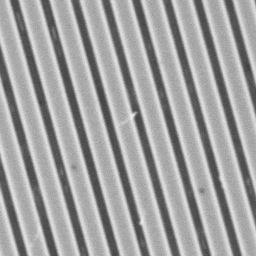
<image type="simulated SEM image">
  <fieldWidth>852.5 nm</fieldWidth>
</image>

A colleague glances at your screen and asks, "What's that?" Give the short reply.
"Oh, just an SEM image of parallel lines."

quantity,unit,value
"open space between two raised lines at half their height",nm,30.9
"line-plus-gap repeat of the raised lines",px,29.5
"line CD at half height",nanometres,67.4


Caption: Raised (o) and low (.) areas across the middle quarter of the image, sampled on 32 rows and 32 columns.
.ooooo..oooooo..ooooo...ooooo..o
.ooooo...ooooo..oooooo..ooooo...
..ooooo..ooooo...ooooo..oooooo..
..ooooo..oooooo..ooooo...ooooo..
..ooooo...ooooo..ooooo...ooooo..
..oooooo..ooooo..oooooo..ooooo..
...ooooo..ooooo...ooooo..oooooo.
...ooooo..oooooo..ooooo...ooooo.
o..ooooo...ooooo..oooooo..ooooo.
o..oooooo..ooooo...ooooo..ooooo.
o...ooooo..oooooo..ooooo..oooooo
oo..ooooo...ooooo..oooooo..ooooo
oo..ooooo...oooooo.oooooo..ooooo
oo...ooooo..ooooo...ooooo..ooooo
oo...ooooo..oooooo..ooooo...oooo
ooo..ooooo...ooooo..oooooo..oooo
ooo..oooooo..ooooo..oooooo..oooo
ooo...ooooo..ooooo...ooooo..oooo
ooo...ooooo..oooooo..ooooo...ooo
oooo..ooooo...ooooo..oooooo..ooo
oooo..oooooo..ooooo...ooooo..ooo
oooo...ooooo..ooooo...ooooo...oo
ooooo..ooooo...ooooo..oooooo..oo
ooooo..oooooo..ooooo..oooooo..oo
ooooo...ooooo..ooooo...ooooo..oo
ooooo...ooooo..oooooo..ooooo...o
oooooo..ooooo...ooooo..ooooo...o
.ooooo..oooooo..ooooo...ooooo..o
.ooooo...ooooo..ooooo...ooooo..o
.oooooo..ooooo...ooooo..oooooo..
..ooooo..ooooo...ooooo..oooooo..
..ooooo...ooooo..ooooo...ooooo..